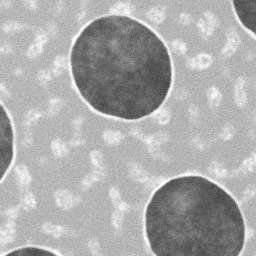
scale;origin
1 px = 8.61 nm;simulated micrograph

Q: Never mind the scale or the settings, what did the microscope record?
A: holes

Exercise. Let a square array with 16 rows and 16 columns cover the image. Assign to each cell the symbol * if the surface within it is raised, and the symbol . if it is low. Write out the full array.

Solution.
***************.
******...******.
*****.....******
****.......*****
****.......*****
*****......*****
******....******
.***************
.***************
.***************
.***************
**********...***
*********......*
*********......*
*********......*
*..******......*